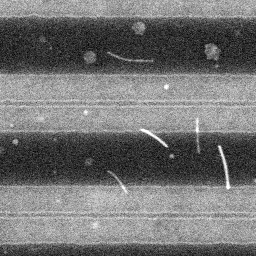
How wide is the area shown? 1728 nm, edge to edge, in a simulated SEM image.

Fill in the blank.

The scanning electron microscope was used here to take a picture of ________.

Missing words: lines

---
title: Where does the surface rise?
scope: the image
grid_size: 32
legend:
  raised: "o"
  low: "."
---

................................
................................
oooooooooooooooooooooooooooooooo
oooooooooooooooooooooooooooooooo
oooooooooooooooooooooooooooooooo
oooooooooooooooooooooooooooooooo
oooooooooooooooooooooooooooooooo
oooooooooooooooooooooooooooooooo
oooooooooooooooooooooooooooooooo
................................
................................
................................
.o..............................
................................
................................
................................
oooooooooooooooooooooooooooooooo
oooooooooooooooooooooooooooooooo
oooooooooooooooooooooooooooooooo
oooooooooooooooooooooooooooooooo
oooooooooooooooooooooooooooooooo
oooooooooooooooooooooooooooooooo
oooooooooooooooooooooooooooooooo
................................
................................
................................
o...ooo.............oo.....ooo..
................................
................................
................................
oooooooooooooooooooooooooooooooo
oooooooooooooooooooooooooooooooo